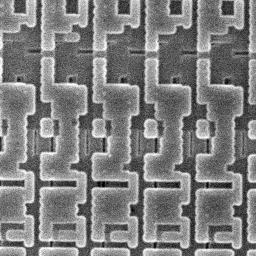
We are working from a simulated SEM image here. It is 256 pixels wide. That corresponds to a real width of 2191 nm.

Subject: wiring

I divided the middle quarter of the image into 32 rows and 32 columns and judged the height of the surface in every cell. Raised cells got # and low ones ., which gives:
........##..........###.........
........##..........###.........
........##..........###.........
.......###..........###.........
.......###..........###.........
#####...#########...#########...
######.############.############
######.############.############
######.############.############
######..###########..###########
######....#########....#########
#####.....#########....########.
#####.....########.....########.
####......#######......#######..
####...###..#####...###..####...
###....###..#####...###..#####..
####...###..####....###..####...
####...###..#####...###..####...
###........#####........#####...
####.......#####........#####...
###........#####........#####...
###........#####........#####...
###.....########........#####...
###....##########...#########...
###....#########....#########...
#......########.....#######.....
##.....########.....########....
#####..###########..###########.
#####..###########..###########.
...##...........##...........##.
...##...........##...........##.
#####..###########..###########.